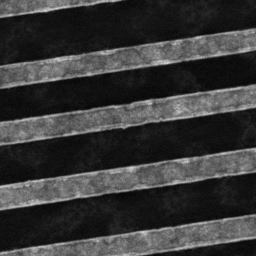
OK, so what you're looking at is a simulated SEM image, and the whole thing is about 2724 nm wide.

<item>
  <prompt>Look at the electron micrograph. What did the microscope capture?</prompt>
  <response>parallel lines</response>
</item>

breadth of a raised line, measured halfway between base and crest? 226 nm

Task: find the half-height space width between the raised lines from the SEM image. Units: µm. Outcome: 0.443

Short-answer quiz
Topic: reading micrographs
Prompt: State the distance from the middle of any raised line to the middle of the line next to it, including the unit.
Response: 0.644 micrometres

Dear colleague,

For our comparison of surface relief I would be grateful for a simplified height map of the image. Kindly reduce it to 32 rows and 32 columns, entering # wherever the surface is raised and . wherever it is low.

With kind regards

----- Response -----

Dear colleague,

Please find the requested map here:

############....................
####............................
................................
................................
.........................#######
...................#############
............##################..
......#################.........
#################...............
##########......................
###.............................
..........................######
...................#############
.............##################.
......###################.......
##################..............
###########.....................
####............................
................................
..........................######
...................#############
............####################
.....####################.......
##################..............
###########.....................
#####...........................
................................
............................####
.....................###########
..............##################
.......###################......
.###################............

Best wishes